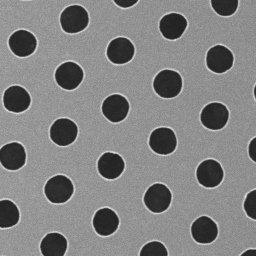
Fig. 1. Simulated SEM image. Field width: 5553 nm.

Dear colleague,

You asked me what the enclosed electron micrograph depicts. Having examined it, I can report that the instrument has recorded a regular array of holes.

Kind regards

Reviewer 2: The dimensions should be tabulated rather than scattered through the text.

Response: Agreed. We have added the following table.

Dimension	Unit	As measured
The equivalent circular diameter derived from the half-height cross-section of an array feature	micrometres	0.599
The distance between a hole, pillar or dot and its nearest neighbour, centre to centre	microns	1.22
